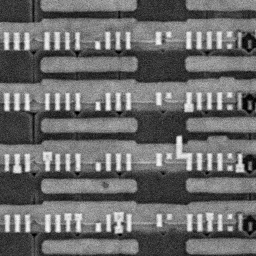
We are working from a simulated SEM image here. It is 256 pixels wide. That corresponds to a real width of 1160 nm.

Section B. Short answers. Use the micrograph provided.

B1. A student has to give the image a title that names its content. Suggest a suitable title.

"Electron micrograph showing wiring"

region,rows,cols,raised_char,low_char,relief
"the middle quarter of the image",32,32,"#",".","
##################............##
##################.............#
................................
................................
##################.............#
################################
################################
################################
################################
##.######.##.#.##......#......##
...#....#....#................##
..............................##
................................
................................
##################.............#
##################.............#
##################.............#
................................
............................#...
##################..........#..#
################################
################################
################################
################################
####.###################.#######
...#....#....#.................#
................................
................................
................................
##################.............#
##################.............#
##################.............#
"